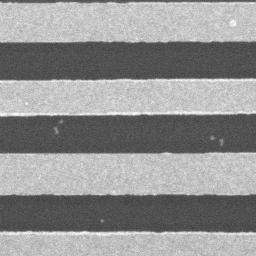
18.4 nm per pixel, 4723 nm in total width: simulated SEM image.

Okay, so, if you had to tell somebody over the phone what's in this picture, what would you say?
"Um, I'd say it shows lines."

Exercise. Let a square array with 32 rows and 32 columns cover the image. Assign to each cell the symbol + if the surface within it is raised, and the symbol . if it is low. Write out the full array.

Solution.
++++++++++++++++++++++++++++++++
++++++++++++++++++++++++++++++++
++++++++++++++++++++++++++++++++
++++++++++++++++++++++++++++++++
++++++++++++++++++++++++++++++++
................................
................................
................................
................................
................................
++++++++++++++++++++++++++++++++
++++++++++++++++++++++++++++++++
++++++++++++++++++++++++++++++++
++++++++++++++++++++++++++++++++
................................
................................
................................
................................
................................
++++++++++++++++++++++++++++++++
++++++++++++++++++++++++++++++++
++++++++++++++++++++++++++++++++
++++++++++++++++++++++++++++++++
++++++++++++++++++++++++++++++++
................................
................................
................................
................................
................................
++++++++++++++++++++++++++++++++
++++++++++++++++++++++++++++++++
++++++++++++++++++++++++++++++++